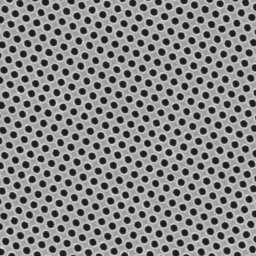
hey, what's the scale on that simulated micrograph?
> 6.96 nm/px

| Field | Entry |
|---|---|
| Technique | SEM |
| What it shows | a regular array of holes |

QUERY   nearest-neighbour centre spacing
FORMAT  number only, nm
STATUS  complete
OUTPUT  77.3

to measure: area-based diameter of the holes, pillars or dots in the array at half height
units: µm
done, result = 0.0527